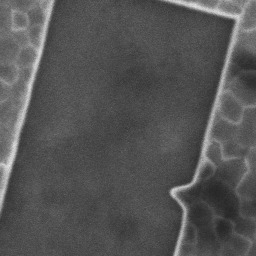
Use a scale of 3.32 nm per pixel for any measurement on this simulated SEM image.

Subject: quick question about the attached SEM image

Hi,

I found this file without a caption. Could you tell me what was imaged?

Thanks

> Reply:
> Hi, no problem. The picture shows one or a few lines or trenches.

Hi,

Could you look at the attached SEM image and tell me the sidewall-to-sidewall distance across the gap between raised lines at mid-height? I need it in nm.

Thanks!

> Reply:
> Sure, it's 604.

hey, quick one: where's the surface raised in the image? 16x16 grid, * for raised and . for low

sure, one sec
***.........****
***............*
***............*
**............**
**............**
**............**
**...........***
*............***
*............***
*............***
*...........****
............****
...........*****
...........*****
...........*****
...........*****